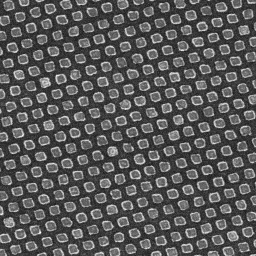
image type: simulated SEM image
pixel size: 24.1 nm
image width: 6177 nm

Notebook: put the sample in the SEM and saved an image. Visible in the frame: a regular array of raised bodies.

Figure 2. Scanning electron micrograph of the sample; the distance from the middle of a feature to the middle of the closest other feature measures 374 nanometers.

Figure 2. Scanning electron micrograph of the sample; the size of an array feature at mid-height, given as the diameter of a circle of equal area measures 0.236 µm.